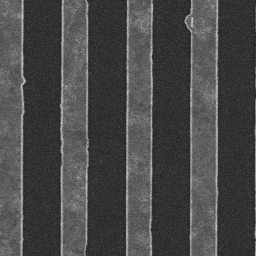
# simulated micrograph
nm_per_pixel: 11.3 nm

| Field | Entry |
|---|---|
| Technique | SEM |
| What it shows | one or a few lines or trenches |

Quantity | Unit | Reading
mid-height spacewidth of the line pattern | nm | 458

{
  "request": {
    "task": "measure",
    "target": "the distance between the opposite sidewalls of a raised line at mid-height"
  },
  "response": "281 nanometers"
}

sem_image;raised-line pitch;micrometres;0.734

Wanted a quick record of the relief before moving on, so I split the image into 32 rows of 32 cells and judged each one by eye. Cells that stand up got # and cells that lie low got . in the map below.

###.....###.....###.....###.....
###.....###.....###.....###.....
###.....###.....###....####.....
###.....###.....###.....###.....
###.....###.....###.....###.....
###.....###.....###.....###.....
###.....###.....###.....###.....
###.....###.....###.....###.....
###.....###.....###.....###.....
###.....###.....###.....###.....
###.....###.....###.....###.....
###.....###.....###.....###.....
###.....###.....###.....###.....
###.....###.....###.....###.....
###.....###.....###.....###.....
###.....###.....###.....###.....
###.....###.....###.....###.....
###.....###.....###.....###.....
###.....###.....###.....###.....
###.....###.....###.....###.....
###.....###.....###.....###.....
###.....###.....###.....###.....
###.....###.....###.....###.....
###.....###.....###.....###.....
###.....###.....###.....###.....
###.....###.....###.....###.....
###.....###.....###.....###.....
###.....###.....###.....###.....
###.....###.....###.....###.....
###.....###.....###.....###.....
###.....###.....###.....###.....
###.....###.....###.....###.....